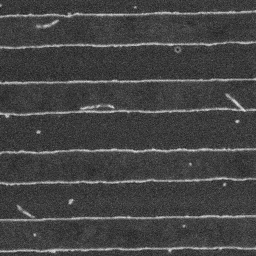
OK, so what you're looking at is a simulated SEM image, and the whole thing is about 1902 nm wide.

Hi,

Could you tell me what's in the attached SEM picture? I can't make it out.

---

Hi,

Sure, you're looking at lines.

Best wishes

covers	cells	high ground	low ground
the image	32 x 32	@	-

--------------------------------
------------------------------@@
@@@@@@@@@@@@@@@@@@@@@@@@@@@@@@@@
@@@@@@@@@@@@@@@@@@@@@@@@@@@@@@@@
@@@@@@@@@@@@@@@@@@@@@@@@@@@@@@@@
@@@@@@@@@@@@@@@@@@@@@@@@@@@-----
--------------------------------
--------------------------------
--------------------------------
--------------------------------
@@@@@@@@@@@@@@@@@@@@@@@@@@@@@@@@
@@@@@@@@@@@@@@@@@@@@@@@@@@@@@@@@
@@@@@@@@@@@@@@@@@@@@@@@@@@@@@@@@
@@@@@@@@@@@@@@@@@@@@@@@@@@@@@@@@
--------------------------------
--------------------------------
--------------------------------
--------------------------------
--------------------------------
@@@@@@@@@@@@@@@@@@@@@@@@@@@@@@@@
@@@@@@@@@@@@@@@@@@@@@@@@@@@@@@@@
@@@@@@@@@@@@@@@@@@@@@@@@@@@@@@@@
@@@@@@@@@@@@@@@@@@@@@@@@@-------
--------------------------------
--------------------------------
--------------------------------
--------------------------------
@@@@@@@@@@@@@@@@@@@@@@@@@@@@@@@@
@@@@@@@@@@@@@@@@@@@@@@@@@@@@@@@@
@@@@@@@@@@@@@@@@@@@@@@@@@@@@@@@@
@@@@@@@@@@@@@@@@@@@@@@@@@@@@@@@@
--------------------------------